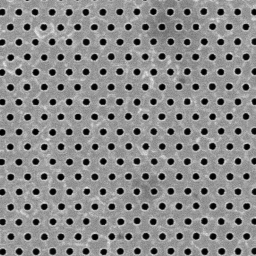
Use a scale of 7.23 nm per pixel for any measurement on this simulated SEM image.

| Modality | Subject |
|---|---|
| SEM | a regular array of holes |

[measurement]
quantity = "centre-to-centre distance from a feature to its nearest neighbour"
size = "120 nanometres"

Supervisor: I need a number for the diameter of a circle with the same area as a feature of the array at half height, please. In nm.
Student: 49.6